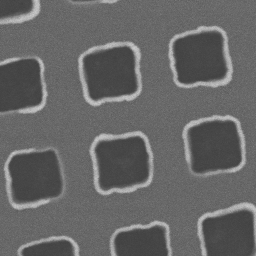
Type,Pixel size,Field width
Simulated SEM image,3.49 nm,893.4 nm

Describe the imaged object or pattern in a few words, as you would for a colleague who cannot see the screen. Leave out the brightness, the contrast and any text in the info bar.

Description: holes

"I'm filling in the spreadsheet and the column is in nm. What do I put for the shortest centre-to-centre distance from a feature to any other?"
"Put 314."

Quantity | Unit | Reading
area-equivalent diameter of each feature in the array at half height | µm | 0.188